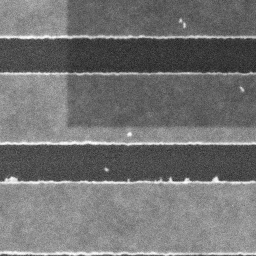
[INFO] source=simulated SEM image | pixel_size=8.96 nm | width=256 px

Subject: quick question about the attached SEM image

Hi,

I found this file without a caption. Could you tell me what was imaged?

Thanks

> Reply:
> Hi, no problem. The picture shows lines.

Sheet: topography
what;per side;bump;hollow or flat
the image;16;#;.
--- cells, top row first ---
################
################
................
................
................
################
################
################
################
................
................
################
################
################
################
################